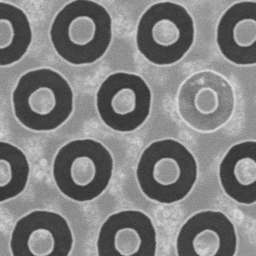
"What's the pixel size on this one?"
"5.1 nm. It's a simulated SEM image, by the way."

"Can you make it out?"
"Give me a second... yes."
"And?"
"ring-shaped grooves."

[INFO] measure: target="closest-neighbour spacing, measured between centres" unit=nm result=406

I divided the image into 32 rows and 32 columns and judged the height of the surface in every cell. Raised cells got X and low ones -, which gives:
-XXXXXXXX---XXXXXXXX--XXXXXXX---
---XXXX------XXXXX-----XXXXX----
X---XXX--XX---XXXX------XXXX--XX
XX--XX---XXX--XXX--XXX--XXX--XXX
XX--XX---XXX--XXX--XXX--XXX--XXX
X---XXX-------XXX---X---XXX---X-
---XXXX------XXXXX-----XXXXX----
--XXXXXX----XXXXXXX---XXXXXXX---
XXXXXXXXXXXXXXXXXXXXXXXXXXXXXXXX
XXX-----XXXXXX---XXXXXXXXXXXXXXX
XX-------XXXX-----XXXXXXXXXXXXXX
XX--XX---XXX---X---XXXXXXXXXXXXX
XX--XXX--XXX--XXX--XXXXXXXXXXXXX
XX--XXX--XXX--XXX--XXXXXXXXXXXXX
XX-------XXXX-----XXXXXXXXXXXXXX
XXX-----XXXXX-----XXXXXXXXXXXXXX
XXXXXXXXXXXXXXX-XXXXXXXXXXXXXXXX
XXXXXXXXX---XXXXXXXX--XXXXXXXXXX
--XXXXXX-----XXXXX-----XXXXXX---
---XXXX-------XXXX------XXXX----
X---XXX--XXX--XXX---XX---XXX--XX
X---XXX--XXX--XXX--XXX---XX--XXX
X--XXXX--XX---XXX---XX--XXXX--XX
---XXXX------XXXXX------XXXX----
--XXXXXX----XXXXXX-----XXXXXX---
XXXXXXXXXXXXXXXXXXXXXXXXXXXXXXXX
XXXX---XXXXXXXX---XXXXXXX--XXXXX
XX------XXXXX------XXXX------XXX
XX-------XXXX------XXXX------XXX
X---XXX--XXX---XX---XX---XX--XXX
X---XXX--XXX--XXX---XX--XXX---XX
XX--XX---XXX---XX--XXX---XX--XXX